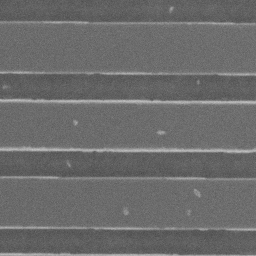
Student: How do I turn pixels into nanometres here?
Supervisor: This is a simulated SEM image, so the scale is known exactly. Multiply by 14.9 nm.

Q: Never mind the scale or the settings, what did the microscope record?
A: lines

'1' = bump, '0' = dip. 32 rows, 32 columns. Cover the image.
00000000000000000000000000000000
00000000000000000000000000000000
00000000000000000000000000000000
11111111111111111111111111111111
11111111111111111111111111111111
11111111111111111111111111111111
11111111111111111111111111111111
11111111111111111111111111111111
11111111111111111111111111111111
00000000000000000000000000000000
00000000000000000000000000000000
00000000000000000000000000000000
11000000000000000000000000000000
11111111111111111111111111111111
11111111111111111111111111111111
11111111111111111111111111111111
11111111111111111111111111111111
11111111111111111111111111111111
11111111111111111111111111111111
00000000000000000000000000000000
00000000000000000000000000000000
00000000000000000000000000000000
11111111111111111111111111111111
11111111111111111111111111111111
11111111111111111111111111111111
11111111111111111111111111111111
11111111111111111111111111111111
11111111111111111111111111111111
00000000000001111111111111111111
00000000000000000000000000000000
00000000000000000000000000000000
00000000000000000000000000000000